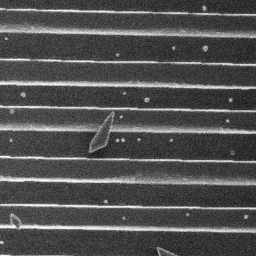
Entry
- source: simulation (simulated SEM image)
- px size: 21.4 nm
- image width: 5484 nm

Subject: lines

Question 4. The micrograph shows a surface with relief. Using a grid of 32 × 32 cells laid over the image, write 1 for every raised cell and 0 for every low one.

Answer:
00000000000000000000000000000000
11111111111110000000000000000000
11111111111111111111111111111111
11111111111111111111111111111111
00000000000000000000000000000000
00000000000000000000000000000000
00000000000000000000000000000000
11100000000000000000000000000000
11111111111111111111111111111111
11111111111111111111111111111111
00000000000111111111111111111111
00000000000000000000000000000000
00000000000000000000000000000000
11111111111000000000000000000000
11111111111111111111111111111111
11111111111111111111111111111111
00000000000011000000000000001111
00000000000010000000000000000000
00000000000110000000000000000000
00000000000000000000000000000000
11111111111111111111111111111111
11111111111111111111111111111111
01101111111111111111111111111111
00000000000000000000000000000000
00000000000000000000000000000000
00000000000000000000000000000000
11111111111111111111111111111111
11111111111111111111111111111111
00000000001111111111111111111111
00000000000000000000000000000000
00000000000000000000000000000000
00000000000000000000100000000000